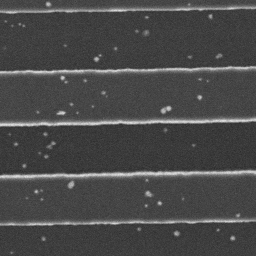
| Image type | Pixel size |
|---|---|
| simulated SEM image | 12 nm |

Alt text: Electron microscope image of lines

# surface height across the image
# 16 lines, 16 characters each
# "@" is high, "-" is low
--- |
@@@@@@@@@@@@@@@-
----------------
----------------
----------------
@@@@@@@@@@@@@@@@
@@@@@@@@@@@@@@@@
@@@@@@@@@@@@@@@@
@@@@@@@@@@@@@@@@
----------------
----------------
----------------
@@@@@@@@@@@@@@@@
@@@@@@@@@@@@@@@@
@@@@@@@@@@@@@@@@
----------------
----------------